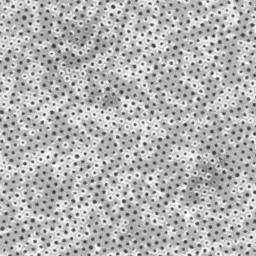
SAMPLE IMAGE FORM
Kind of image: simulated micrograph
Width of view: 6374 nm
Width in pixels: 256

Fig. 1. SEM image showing a regular array of holes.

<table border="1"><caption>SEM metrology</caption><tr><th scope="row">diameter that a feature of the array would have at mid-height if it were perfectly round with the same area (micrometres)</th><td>0.101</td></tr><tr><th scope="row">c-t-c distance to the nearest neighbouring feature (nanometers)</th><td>194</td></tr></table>